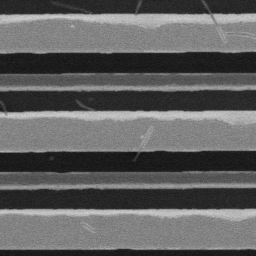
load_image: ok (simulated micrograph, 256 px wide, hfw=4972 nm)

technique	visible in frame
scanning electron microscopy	lines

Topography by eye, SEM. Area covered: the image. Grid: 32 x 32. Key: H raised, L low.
LLLLLLLLLLLLLLLLLLLLLLLLLLLLLLLL
LLLLLLLLLLLLLLLLLLLLLLLLLLLLLLLL
HHHHHHHHHHHHHHHHHHLHHHHHHHHHHHHH
HHHHHHHHHHHHHHHHHHHHHHHHHHHHHHHH
HHHHHHHHHHHHHHHHHHHHHHHHHHHHHHHH
HHHHHHHHHHHHHHHHHHHHHHHHHHHHHHHH
HHHHHHHHHHHHHHHHHHHHHHHLLLLLHHLL
LLLLLLLLLLLLLLLLLLLLLLLLLLLLLLLL
LLLLLLLLLLLLLLLLLLLLLLLLLLLLLLLL
HHHHHHHHHHHHHHHHHHHHHHHHHHHHHHHH
HHHHHHHHHHHHHHHHHHHHHHHHHHHHHHHH
LLLLLLLLLLLLLLLLLLLLLLLLLLLLLLLL
LLLLLLLLLLLLLLLLLLLLLLLLLLLLLLLL
LLLLLLLLLLLLLLLLLLLLLLLLLLLLLLLL
HHHHHHHHHHHHHHHHHHHHHHHHHHHHHLLL
HHHHHHHHHHHHHHHHHHHHHHHHHHHHHHHH
HHHHHHHHHHHHHHHHHHHHHHHHHHHHHHHH
HHHHHHHHHHHHHHHHHHHHHHHHHHHHHHHH
HHHHHHHHHHHHHHHHHHHHHHHHHHHHHHHH
LLLLLLLLLLLLLLLLLLLLLLLLLLLLLLLL
LLLLLLLLLLLLLLLLLLLLLLLLLLLLLLLL
LLLLLLLLLLLLLLLLLLLLLLLHHHHHHHHH
HHHHHHHHHHHHHHHHHHHHHHHHHHHHHHHH
HHHHHHHHHHLLLLLLLLLLLLLLLLLLLLLL
LLLLLLLLLLLLLLLLLLLLLLLLLLLLLLLL
LLLLLLLLLLLLLLLLLLLLLLLLLLLLLLLL
HHHHHLHHHLHHHHHHHHHHLLLHHHLLLLLL
HHHHHHHHHHHHHHHHHHHHHHHHHHHHHHHH
HHHHHHHHHHHHHHHHHHHHHHHHHHHHHHHH
HHHHHHHHHHHHHHHHHHHHHHHHHHHHHHHH
HHHHHHHHHHHHHHHHHHHHHHHHHHHHHHHH
LLLLLLLLLLLLLLLLLLLLLLLLLLLLLLLL